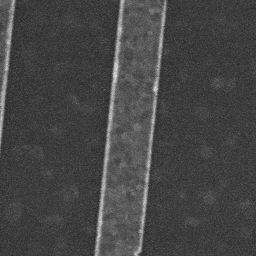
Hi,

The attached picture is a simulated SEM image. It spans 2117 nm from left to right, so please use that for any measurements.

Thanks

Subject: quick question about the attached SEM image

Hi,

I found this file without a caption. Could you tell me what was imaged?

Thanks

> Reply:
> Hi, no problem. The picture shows one or a few lines or trenches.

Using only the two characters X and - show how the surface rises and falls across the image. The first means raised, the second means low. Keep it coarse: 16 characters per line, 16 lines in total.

X-------XX------
X------XXX------
X------XXX------
-------XXX------
-------XXX------
-------XXX------
-------XXX------
-------XXX------
-------XX-------
-------XX-------
-------XX-------
------XXX-------
------XXX-------
------XXX-------
------XXX-------
------XXX-------